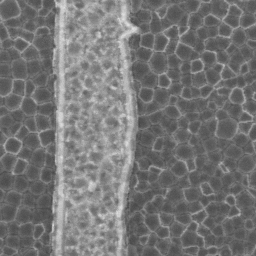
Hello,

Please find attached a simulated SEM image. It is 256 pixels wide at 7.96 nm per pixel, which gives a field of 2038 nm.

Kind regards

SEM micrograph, one or a few lines or trenches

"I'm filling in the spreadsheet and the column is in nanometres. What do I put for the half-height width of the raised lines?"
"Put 505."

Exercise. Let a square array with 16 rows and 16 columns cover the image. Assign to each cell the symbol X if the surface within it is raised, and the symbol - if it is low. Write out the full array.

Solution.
----XXXX--------
----XXXX--------
----XXXX--------
----XXXX--------
----XXXX--------
----XXXX--------
----XXXX--------
----XXXX--------
----XXXX--------
----XXXX--------
----XXXX--------
----XXXX--------
----XXXX--------
----XXXX--------
----XXX---------
----XXX---------